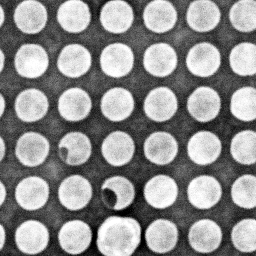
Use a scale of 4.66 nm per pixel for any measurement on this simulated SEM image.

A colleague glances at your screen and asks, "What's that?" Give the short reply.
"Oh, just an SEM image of a regular array of raised bodies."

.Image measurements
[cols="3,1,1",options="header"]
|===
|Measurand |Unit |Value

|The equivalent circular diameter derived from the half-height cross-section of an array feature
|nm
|154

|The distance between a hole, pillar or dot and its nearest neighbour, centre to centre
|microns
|0.201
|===